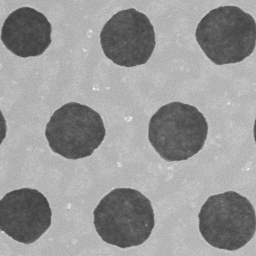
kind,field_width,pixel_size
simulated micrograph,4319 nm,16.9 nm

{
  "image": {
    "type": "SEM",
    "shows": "holes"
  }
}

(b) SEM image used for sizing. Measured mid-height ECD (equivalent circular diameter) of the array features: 964 nm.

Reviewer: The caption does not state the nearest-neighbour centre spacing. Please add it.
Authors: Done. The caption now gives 1720 nm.